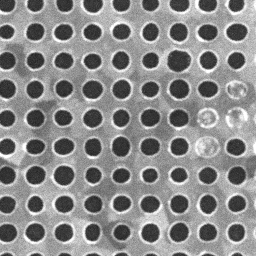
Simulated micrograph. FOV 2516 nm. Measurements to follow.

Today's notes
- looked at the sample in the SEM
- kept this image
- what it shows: a regular array of holes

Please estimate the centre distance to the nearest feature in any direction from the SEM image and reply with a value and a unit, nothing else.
279 nanometers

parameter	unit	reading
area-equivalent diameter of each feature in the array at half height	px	18.7